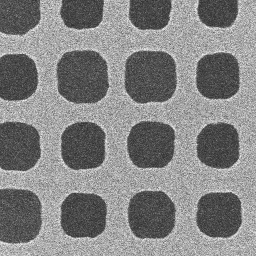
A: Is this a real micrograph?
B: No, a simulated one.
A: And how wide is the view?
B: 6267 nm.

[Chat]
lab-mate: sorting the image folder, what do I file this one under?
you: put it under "a regular array of holes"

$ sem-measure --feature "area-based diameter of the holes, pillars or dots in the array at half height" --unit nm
1190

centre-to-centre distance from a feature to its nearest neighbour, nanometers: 1660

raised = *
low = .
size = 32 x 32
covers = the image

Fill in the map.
.....***.....***.....****.....**
.....**......***.....****.....**
.....***.....***.....****....***
....*****..******...************
********************************
********************************
*********...*****....***********
....***......***......***.....**
.....**.......**......***.....**
.....**.......**......**......**
.....**.......**......**......**
....***......***......***.....**
*..*****.....****....***********
********************************
********************************
....*****...*****....******..***
.....***.....***......***.....**
.....***.....***......***.....**
.....***.....***......***.....**
.....***.....***......***.....**
.....***.....****....*****...***
********************************
********************************
********************************
.....****...*****....****.....**
.....***.....***......***.....**
.....***.....***......***.....**
.....***.....***......***.....**
.....***.....***......***.....**
.....****...*****....*****...***
********************************
********************************